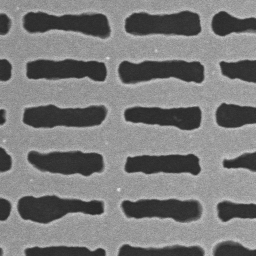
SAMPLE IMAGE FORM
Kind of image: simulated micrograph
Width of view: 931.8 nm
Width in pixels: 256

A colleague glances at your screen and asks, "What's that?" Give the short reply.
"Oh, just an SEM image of a regular array of holes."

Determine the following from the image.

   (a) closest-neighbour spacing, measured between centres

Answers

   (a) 168 nm